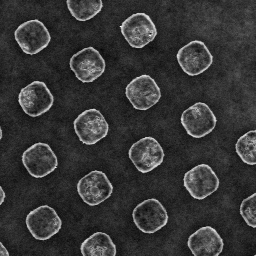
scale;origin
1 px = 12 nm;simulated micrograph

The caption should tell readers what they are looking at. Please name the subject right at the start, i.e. a regular array of raised bodies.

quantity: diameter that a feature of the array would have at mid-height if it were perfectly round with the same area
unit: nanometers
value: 397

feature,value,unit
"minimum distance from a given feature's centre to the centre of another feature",740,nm